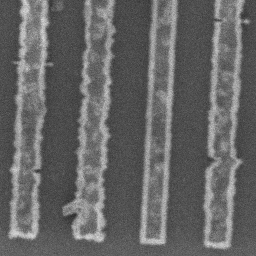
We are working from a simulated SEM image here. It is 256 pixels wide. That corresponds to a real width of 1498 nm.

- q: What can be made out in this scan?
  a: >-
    one or a few lines or trenches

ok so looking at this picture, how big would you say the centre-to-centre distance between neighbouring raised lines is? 0.379 um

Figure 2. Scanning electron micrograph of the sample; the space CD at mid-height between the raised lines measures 42.9 pixels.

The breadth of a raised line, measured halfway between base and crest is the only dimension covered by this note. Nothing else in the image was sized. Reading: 22 px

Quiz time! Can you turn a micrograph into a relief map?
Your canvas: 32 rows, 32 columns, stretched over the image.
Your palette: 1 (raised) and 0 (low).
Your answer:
00011100000111000001110000011100
00011100000111000001110000011100
00011100000111000001110000011100
00011100000111000001110000011100
00011100000111000001110000011100
00011100000111000001110000011100
00011100000111000001110000011100
00011000000110000001100000011100
00011000000110000001100000011100
00011000001111000001100000011100
00111000000111000001100000011100
00011000001110000001100000011100
00111000000110000001100000011100
00111100001110000001100000011000
00111000001110000001100000111000
00111000001110000001100000111000
00111000001110000001100000111000
00111000001110000011100000111000
00111000001110000011100000111000
00111000001110000011100000111000
00111000001110000011100000011100
00110000001110000011100000111000
00111000001100000011100000111000
00111000001110000011100000111000
00110000001110000011100000111000
00111000011100000011100000111000
00110000111100000011000000111000
00111000001110000011000000111000
00110000011110000011000000111000
00000000001100000011000000111000
00000000000000000000000000110000
00000000000000000000000000000000